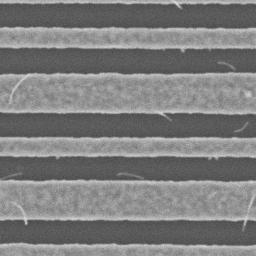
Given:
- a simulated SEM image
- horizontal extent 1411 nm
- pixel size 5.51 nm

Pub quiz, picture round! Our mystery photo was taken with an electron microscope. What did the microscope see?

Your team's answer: lines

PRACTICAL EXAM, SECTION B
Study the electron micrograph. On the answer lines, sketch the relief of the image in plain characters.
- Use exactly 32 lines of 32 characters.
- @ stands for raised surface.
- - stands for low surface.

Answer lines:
----------------------@---------
--------------------------------
--------------------------------
@-@@@@@@------@-----------------
@@@@@@@@@@@@@@@@@@@@@@@@@@@@@@@@
@@@@@@@@@@@@@@@@@@@@@@@@@@@@@@@@
--------------------------------
--------------------------------
--------------------------------
@@@@@@@@@@@@@@@@@@@@@@@@@@@@@@@@
@@@@@@@@@@@@@@@@@@@@@@@@@@@@@@@@
@@@@@@@@@@@@@@@@@@@@@@@@@@@@@@@@
@@@@@@@@@@@@@@@@@@@@@@@@@@@@@@@@
@@@@@@@@@@@@@@@@@@@@@@@@@@@@@@@@
--------------------------------
--------------------------------
--------------------------------
@@@@@@@@@@@@@@@@@@@@@@@@@@@@@@@@
@@@@@@@@@@@@@@@@@@@@@@@@@@@@@@@@
-@@@@@-@--@@@--@@@@@--@@@@@@-@@@
--------------------------------
--------------------------------
--------------------------------
@@@@@@@@@@@@@@@@@@@@@@@@@@@@@@@@
@@@@@@@@@@@@@@@@@@@@@@@@@@@@@@@@
@@@@@@@@@@@@@@@@@@@@@@@@@@@@@@@@
@@@@@@@@@@@@@@@@@@@@@@@@@@@@@@@@
---@-------------------------@@-
--------------------------------
--------------------------------
@@@@-----@----------------------
@@@@@@@@@@@@@@@@@@@@@@@@@@@@@@@@